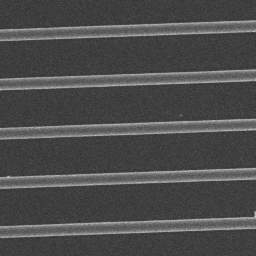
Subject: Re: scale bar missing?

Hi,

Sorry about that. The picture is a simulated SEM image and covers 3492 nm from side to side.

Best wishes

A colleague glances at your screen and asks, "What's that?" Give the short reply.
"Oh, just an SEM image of parallel lines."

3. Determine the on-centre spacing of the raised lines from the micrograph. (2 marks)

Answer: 671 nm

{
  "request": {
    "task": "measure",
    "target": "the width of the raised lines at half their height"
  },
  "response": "140 nm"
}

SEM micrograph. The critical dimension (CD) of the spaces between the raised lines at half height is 0.532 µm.